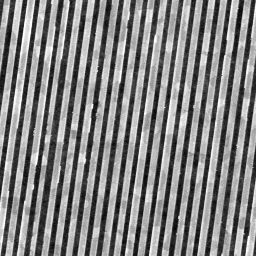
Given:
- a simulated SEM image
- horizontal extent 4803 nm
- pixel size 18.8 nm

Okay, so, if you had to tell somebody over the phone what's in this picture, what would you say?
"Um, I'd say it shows parallel lines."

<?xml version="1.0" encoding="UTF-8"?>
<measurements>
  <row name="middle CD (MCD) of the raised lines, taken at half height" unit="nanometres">107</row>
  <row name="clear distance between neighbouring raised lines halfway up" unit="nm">109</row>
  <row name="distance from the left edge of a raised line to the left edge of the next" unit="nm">224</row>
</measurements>